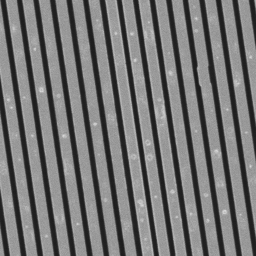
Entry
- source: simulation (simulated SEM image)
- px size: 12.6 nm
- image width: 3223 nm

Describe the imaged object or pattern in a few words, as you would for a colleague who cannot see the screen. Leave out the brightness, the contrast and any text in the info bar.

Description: parallel lines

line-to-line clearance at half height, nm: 57.7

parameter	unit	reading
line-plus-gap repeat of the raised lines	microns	0.206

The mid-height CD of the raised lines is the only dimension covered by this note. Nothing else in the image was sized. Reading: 11.8 px